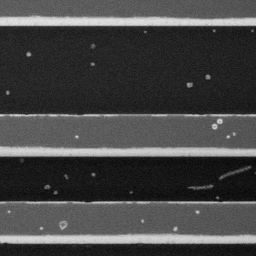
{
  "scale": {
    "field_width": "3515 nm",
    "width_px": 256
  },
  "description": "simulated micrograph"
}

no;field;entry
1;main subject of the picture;lines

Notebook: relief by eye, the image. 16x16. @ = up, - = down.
@@@@@@@@@@@@@@@@
----------------
----------------
----------------
----------------
----------------
----------------
@@@@@@@@@@@@@@@@
@@@@@@@@@@@@@@@@
@@@@@@@@@@@@@@@@
----------------
----------------
----------------
@@@@@@@@@@@@@@@@
@@@@@@@@@@@@@@@@
----------------